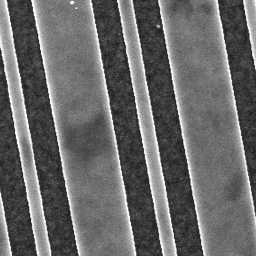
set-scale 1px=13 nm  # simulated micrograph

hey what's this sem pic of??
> lines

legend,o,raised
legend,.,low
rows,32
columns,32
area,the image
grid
o...ooooooo....oo...ooooooo...oo
o...oooooooo...oo...ooooooo....o
o...oooooooo...oo...oooooooo...o
o....ooooooo...oo...oooooooo...o
oo...ooooooo...oo....ooooooo...o
oo...ooooooo....oo...ooooooo...o
oo...oooooooo...oo...ooooooo....
oo...oooooooo...oo...ooooooo....
.o....ooooooo...oo...oooooooo...
.oo...ooooooo...oo...oooooooo...
.oo...ooooooo....o....ooooooo...
.oo...ooooooo....oo...ooooooo...
.oo...oooooooo...oo...ooooooo...
.oo...oooooooo...oo...ooooooo...
..o....ooooooo...oo...oooooooo..
..oo...ooooooo...oo....ooooooo..
..oo...ooooooo....o....ooooooo..
..oo...ooooooo....oo...ooooooo..
..oo...oooooooo...oo...ooooooo..
...o....ooooooo...oo...oooooooo.
...o....ooooooo...oo...oooooooo.
...oo...ooooooo....o....ooooooo.
...oo...ooooooo....oo...ooooooo.
...oo...oooooooo...oo...ooooooo.
...oo...oooooooo...oo...oooooooo
....o....ooooooo...oo...oooooooo
....o....ooooooo...oo....ooooooo
o...oo...ooooooo....o....ooooooo
o...oo...ooooooo....oo...ooooooo
o...oo...oooooooo...oo...ooooooo
o...oo....ooooooo...oo...ooooooo
o....o....ooooooo...oo...ooooooo